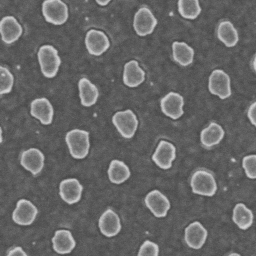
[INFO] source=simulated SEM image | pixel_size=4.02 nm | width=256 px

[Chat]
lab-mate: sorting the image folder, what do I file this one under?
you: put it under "a regular array of raised bodies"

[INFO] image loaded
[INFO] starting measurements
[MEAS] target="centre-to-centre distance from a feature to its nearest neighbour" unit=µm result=0.196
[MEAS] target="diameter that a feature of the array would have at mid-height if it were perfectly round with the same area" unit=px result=23.1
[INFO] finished